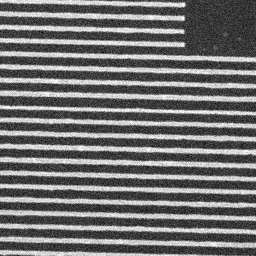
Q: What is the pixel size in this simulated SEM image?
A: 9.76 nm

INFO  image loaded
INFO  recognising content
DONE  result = parallel lines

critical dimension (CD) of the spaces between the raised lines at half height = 91.4 nm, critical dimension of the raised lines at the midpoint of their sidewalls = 36.6 nanometres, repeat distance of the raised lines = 129 nm